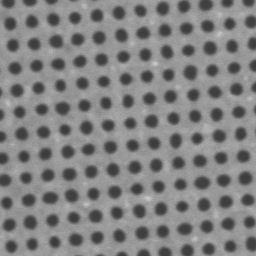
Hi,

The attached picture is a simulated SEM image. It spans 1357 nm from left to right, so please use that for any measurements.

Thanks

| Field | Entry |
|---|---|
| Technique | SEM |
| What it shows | a regular array of holes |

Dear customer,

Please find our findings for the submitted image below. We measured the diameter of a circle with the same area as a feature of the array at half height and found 0.0717 microns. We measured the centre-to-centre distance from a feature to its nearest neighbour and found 114 nm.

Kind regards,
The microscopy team